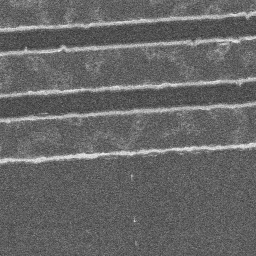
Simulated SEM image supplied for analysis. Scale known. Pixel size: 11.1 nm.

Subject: one or a few lines or trenches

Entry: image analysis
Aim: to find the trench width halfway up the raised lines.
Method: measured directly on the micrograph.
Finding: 260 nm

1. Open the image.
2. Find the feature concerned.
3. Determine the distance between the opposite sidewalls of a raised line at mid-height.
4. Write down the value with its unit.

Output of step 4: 470 nm